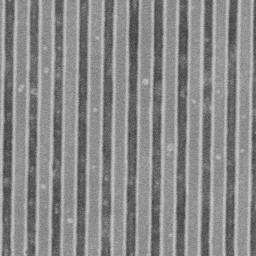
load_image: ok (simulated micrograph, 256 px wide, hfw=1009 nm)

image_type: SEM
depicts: parallel lines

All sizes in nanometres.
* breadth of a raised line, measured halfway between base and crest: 57.1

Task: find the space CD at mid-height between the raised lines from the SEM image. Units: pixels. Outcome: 10.3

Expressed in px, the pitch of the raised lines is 24.8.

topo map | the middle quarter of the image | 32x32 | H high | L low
HHHLLLHHHHLLLHHHLLLHHHLLLHHHLLLH
HHHLLLHHHHLLHHHHLLLHHHLLLHHHLLLH
HHHLLLHHHHLLHHHHLLLHHHLLLHHHLLLH
HHHLLLHHHHLLHHHHLLLHHHLLLHHHLLLH
HHHLLLHHHHLLHHHHLLLHHHLLLHHHLLLH
HHHLLLHHHHLLHHHHLLLHHHLLLHHHLLLH
HHHLLLHHHHLLHHHHLLLHHHLLLHHHLLLH
HHHLLLHHHHLLHHHHLLLHHHLLLHHHLLLH
HHHLLLHHHHLLHHHHLLLHHHLLLHHHLLLH
HHHLLLHHHHLLHHHHLLLHHHLLLHHHLLLH
HHHLLLHHHHLLHHHHLLLHHHLLLHHHLLLH
HHHLLLHHHHLLHHHHLLLHHHLLLHHHLLLH
HHHLLLHHHHLLHHHHLLLHHHLLLHHHLLLH
HHHLLLHHHHLLHHHHLLLHHHLLLHHHLLLH
HHHLLLHHHLLLHHHHLLLHHHLLLHHHLLLH
HHHLLLHHHLLLHHHHLLLHHHLLLHHHLLLH
HHHLLLHHHLLLHHHHLLHHHHLLLHHHLLLH
HHHLLLHHHLLLHHHHLLHHHHLLLHHHLLLH
HHHLLLHHHLLLHHHHLLHHHHLLLHHHLLLH
HHHLLLHHHLLLHHHHLLHHHHLLLHHHLLLH
HHHLLLHHHLLLHHHHLLHHHHLLLHHHLLLH
HHHLLLHHHLLLHHHHLLHHHHLLLHHHLLLH
HHHLLLHHHLLLHHHHLLHHHHLLLHHHLLLH
HHHLLLHHHLLLHHHHLLHHHHLLLHHHLLLH
HHHLLLHHHLLLHHHHLLHHHHLLLHHHLLLH
HHHLLLHHHLLLHHHHLLHHHHLLLHHHLLLH
HHHLLLHHHLLLHHHHLLHHHHLLLHHHLLLH
HHHLLLHHHLLLHHHHLLHHHHLLLHHHLLLH
HHHLLLHHHLLLHHHHLLHHHHLLLHHHLLLH
HHHLLLHHHLLLHHHLLLHHHHLLLHHHLLLH
HHHLLLHHHLLLHHHLLLHHHHLLHHHHLLLH
HHHLLLHHHLLLHHHLLLHHHHLLHHHHLLLH